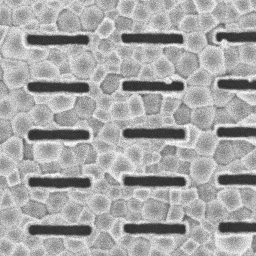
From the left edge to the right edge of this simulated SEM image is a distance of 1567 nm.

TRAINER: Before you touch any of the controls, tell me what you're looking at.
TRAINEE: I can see a regular array of holes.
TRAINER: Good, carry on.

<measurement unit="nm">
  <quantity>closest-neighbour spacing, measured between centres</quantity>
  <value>290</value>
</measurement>